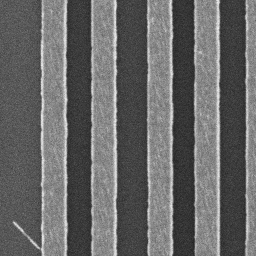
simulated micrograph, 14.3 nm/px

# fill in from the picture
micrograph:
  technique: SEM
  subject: lines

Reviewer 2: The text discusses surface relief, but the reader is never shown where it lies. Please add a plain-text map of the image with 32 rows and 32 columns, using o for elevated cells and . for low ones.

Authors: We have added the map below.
.....ooo...oooo....oo...ooo....o
.....ooo...ooo.....oo...ooo....o
.....ooo...ooo.....oo...ooo....o
.....ooo...ooo.....oo...ooo....o
.....ooo...oooo....ooo..ooo....o
.....ooo...oooo....oo...ooo....o
.....ooo....oo.....oo...ooo....o
.....ooo...oooo....oo...ooo....o
.....ooo...oooo....ooo..ooo....o
.....ooo...ooo.....ooo..ooo....o
.....ooo...ooo.....oo...ooo....o
.....ooo...ooo.....oo...ooo....o
.....ooo...ooo.....oo...ooo....o
.....ooo...oooo....ooo..ooo....o
.....ooo...ooo.....ooo..ooo....o
.....ooo...ooo.....ooo..ooo....o
.....ooo...ooo.....oo...ooo....o
.....ooo...oooo....ooo..ooo....o
.....ooo...oooo....oo...ooo....o
.....ooo...oooo....oo...ooo....o
.....ooo...oooo....ooo..ooo....o
.....ooo...oooo....ooo..ooo....o
.....ooo...oooo....ooo..ooo....o
.....ooo...oooo....oo...ooo....o
.....ooo...oooo....ooo..ooo....o
.....ooo...ooo.....ooo..ooo....o
.....ooo...oooo....ooo..ooo....o
.....ooo....ooo....oo...ooo....o
.....ooo...oooo....ooo..ooo....o
.....ooo...oooo....oo...ooo....o
.....ooo...ooo.....ooo..ooo....o
.....ooo...oooo....ooo..ooo....o